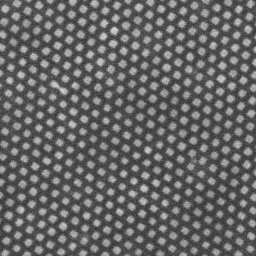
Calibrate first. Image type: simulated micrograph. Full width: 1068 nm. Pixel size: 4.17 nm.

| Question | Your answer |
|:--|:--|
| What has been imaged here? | a regular array of raised bodies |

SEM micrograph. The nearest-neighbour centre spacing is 52.4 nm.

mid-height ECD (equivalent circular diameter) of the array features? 28.2 nm